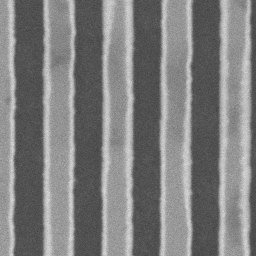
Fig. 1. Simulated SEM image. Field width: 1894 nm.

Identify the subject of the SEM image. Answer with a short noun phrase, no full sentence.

lines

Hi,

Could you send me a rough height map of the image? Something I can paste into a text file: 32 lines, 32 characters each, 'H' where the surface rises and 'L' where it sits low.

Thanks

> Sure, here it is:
HHLLLLHHHLLLLHHHLLLLHHHHLLLLHHHL
HHLLLHHHHLLLLHHHLLLLHHHHLLLLHHHL
HHLLLLHHHLLLLHHHLLLLHHHHLLLLHHHL
HHLLLLHHHLLLLHHHLLLLHHHHLLLLHHHL
HHLLLLHHHLLLLHHHHLLLHHHHLLLLHHHL
HHLLLHHHHLLLLHHHHLLLHHHHLLLLHHHL
HHLLLLHHHLLLLHHHHLLLHHHHLLLLHHHL
HHLLLLHHHLLLLHHHLLLLHHHHLLLLHHHL
HHLLLHHHHLLLLHHHLLLLHHHHLLLLHHHL
HHLLLHHHHLLLLHHHLLLLHHHHLLLLHHHL
HHLLLLHHHLLLLHHHLLLLHHHHLLLLHHHL
HHLLLLHHHLLLLHHHHLLLHHHHLLLLHHHL
HHLLLHHHHLLLLHHHHLLLHHHHLLLLHHHL
HHLLLLHHHLLLLHHHHLLLHHHHLLLLHHHL
HHLLLHHHHLLLLHHHLLLLHHHHLLLLHHHL
HHLLLHHHHLLLLHHHLLLLHHHHLLLLHHHL
HHLLLLHHHLLLLHHHLLLLHHHHLLLLHHHL
HHLLLLHHHLLLLHHHLLLLHHHHLLLLHHHL
HHLLLLHHHLLLLHHHLLLLHHHHLLLLHHHL
HHLLLLHHHLLLLHHHHLLLHHHHLLLLHHHL
HHLLLLHHHLLLLHHHLLLLHHHHLLLLHHHL
HHLLLHHHHLLLLHHHLLLLHHHHLLLLHHHL
HHLLLHHHHLLLLHHHLLLLHHHHLLLLHHHL
HHLLLHHHHLLLLHHHLLLLHHHHLLLLHHHL
HHLLLLHHHLLLLHHHLLLLHHHHLLLLHHHL
HHLLLLHHHLLLLHHHHLLLHHHHLLLLHHHL
HHLLLLHHHLLLLHHHLLLLHHHHLLLLHHHL
HHLLLLHHHLLLLHHHLLLLHHHHLLLLHHHL
HHLLLLHHHLLLLHHHHLLLHHHHLLLLHHHL
HHLLLLHHHLLLLHHHLLLLHHHHLLLHHHHL
HHLLLLHHHLLLLHHHLLLLHHHHLLLHHHHL
HHLLLLHHHLLLLHHHLLLLHHHHLLLLHHHL